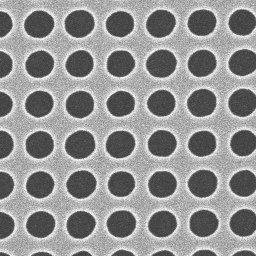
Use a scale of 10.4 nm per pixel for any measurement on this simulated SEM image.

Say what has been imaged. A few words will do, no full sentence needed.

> a regular array of holes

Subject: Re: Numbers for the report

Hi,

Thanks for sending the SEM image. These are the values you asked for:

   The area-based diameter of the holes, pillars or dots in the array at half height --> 296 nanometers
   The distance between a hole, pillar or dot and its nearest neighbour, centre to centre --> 415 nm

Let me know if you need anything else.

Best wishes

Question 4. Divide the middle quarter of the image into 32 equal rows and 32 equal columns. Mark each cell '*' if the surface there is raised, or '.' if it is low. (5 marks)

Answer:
.......****.......**........***.
*......****......****.......***.
*.....******....******.....*****
************************.*******
********************************
********************************
************************.*******
**....******.....*****.....*****
*......****.......***.......***.
.......****.......***.......***.
........***.......***.......***.
*......****......****......****.
*......*****....******.....*****
***..***************************
********************************
********************************
************************.*******
**.....****......*****.....*****
*.......***.......***.......***.
........***.......***.......***.
........**........***.......***.
........***......****.......***.
*......****......*****.....*****
**...********..*****************
********************************
********************************
********************************
**.....*****.....*****.....*****
*.......***......****.......***.
*.......***.......***.......***.
*.......***.......***.......***.
*.......***......****.......***.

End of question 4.